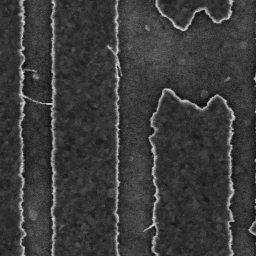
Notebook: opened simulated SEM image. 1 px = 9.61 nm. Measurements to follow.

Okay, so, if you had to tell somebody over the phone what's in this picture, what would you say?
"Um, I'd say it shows one or a few lines or trenches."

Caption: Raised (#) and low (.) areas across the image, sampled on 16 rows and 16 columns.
#..####...####..
#..####....#....
#..####.........
#..####.........
#..####.........
#..####.........
#..####...##.#..
#..####..######.
#..####..#####..
#..####...####..
#..####...####..
#..####...####..
#..####...####..
#..####...####..
#..####...####..
#..####...####..